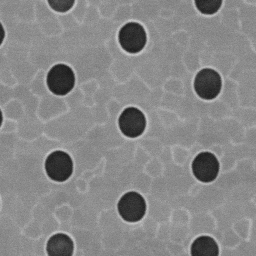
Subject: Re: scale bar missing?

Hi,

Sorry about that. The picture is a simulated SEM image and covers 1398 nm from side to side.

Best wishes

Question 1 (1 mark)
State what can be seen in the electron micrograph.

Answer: holes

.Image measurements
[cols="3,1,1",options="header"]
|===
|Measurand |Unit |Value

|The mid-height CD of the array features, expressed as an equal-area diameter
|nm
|168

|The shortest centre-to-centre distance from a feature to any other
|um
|0.454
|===